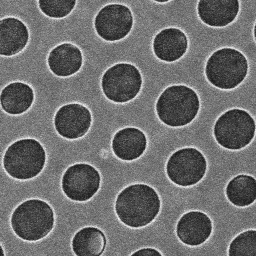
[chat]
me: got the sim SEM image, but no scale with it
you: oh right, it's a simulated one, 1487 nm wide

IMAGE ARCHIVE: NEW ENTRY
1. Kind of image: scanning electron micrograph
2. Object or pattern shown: a regular array of holes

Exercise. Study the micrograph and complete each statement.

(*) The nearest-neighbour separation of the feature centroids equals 0.354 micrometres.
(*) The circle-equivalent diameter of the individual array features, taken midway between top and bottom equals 224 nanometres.